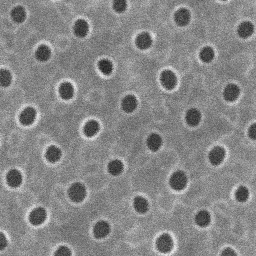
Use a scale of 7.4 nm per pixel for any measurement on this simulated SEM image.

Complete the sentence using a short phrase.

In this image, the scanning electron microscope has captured a regular array of holes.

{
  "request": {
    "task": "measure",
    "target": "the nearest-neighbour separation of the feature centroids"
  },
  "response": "44.8 px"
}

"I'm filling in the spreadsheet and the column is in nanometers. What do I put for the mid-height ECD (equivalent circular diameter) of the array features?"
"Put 141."